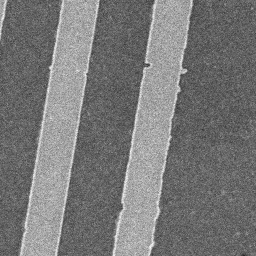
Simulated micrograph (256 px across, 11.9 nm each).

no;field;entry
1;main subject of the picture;one or a few lines or trenches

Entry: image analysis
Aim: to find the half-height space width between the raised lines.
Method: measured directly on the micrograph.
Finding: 666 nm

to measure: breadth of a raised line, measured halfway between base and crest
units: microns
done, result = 0.417